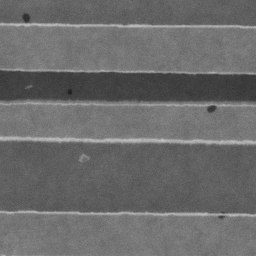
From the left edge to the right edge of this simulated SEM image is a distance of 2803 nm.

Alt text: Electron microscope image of lines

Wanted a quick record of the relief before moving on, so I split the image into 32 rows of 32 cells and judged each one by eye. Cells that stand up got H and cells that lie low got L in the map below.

LLLLLLLLLLLLLLLLLLLLLLLLLLLLLLLL
LLLLLLLLLLLLLLLLLLLLLLLLLLLLLLLL
LLLLLLLLLLLLLLLLLLLLLLLLLLLLLLLL
HHHHHHHHHHHHHHHHHHHHHHHHHHHHHHHH
HHHHHHHHHHHHHHHHHHHHHHHHHHHHHHHH
HHHHHHHHHHHHHHHHHHHHHHHHHHHHHHHH
HHHHHHHHHHHHHHHHHHHHHHHHHHHHHHHH
HHHHHHHHHHHHHHHHHHHHHHHHHHHHHHHH
HHHHHHHHHHHHHHHHHHHHHHHHHHHHHHHH
LLLLLLLLLLLLLLLLLLLLLLLLLLLLLLLL
LLLLLLLLLLLLLLLLLLLLLLLLLLLLLLLL
LLLLLLLLLLLLLLLLLLLLLLLLLLLLLLLL
LLLLLLLLLLLLLLLLLLLLLLLLLLLLLLLL
HHHHHHHHHHHHHHHHHHHHHHHHHHHHHHHH
HHHHHHHHHHHHHHHHHHHHHHHHHHHHHHHH
HHHHHHHHHHHHHHHHHHHHHHHHHHHHHHHH
HHHHHHHHHHHHHHHHHHHHHHHHHHHHHHHH
LLLLLLLLLLLLLLLLLLLLLLHHHHHHHHHH
LLLLLLLLLLLLLLLLLLLLLLLLLLLLLLLL
LLLLLLLLLLLLLLLLLLLLLLLLLLLLLLLL
LLLLLLLLLLLLLLLLLLLLLLLLLLLLLLLL
LLLLLLLLLLLLLLLLLLLLLLLLLLLLLLLL
LLLLLLLLLLLLLLLLLLLLLLLLLLLLLLLL
LLLLLLLLLLLLLLLLLLLLLLLLLLLLLLLL
LLLLLLLLLLLLLLLLLLLLLLLLLLLLLLLL
LLLLLLLLLLLLLLLLLLLLLLLLLLLLLLLL
LLLLLLLLLLLLLLLLLLLLLLLLLLLLLLLL
HHHHHHHHHHHHHHHHHHHHHHHHHHHHHHHH
HHHHHHHHHHHHHHHHHHHHHHHHHHHHHHHH
HHHHHHHHHHHHHHHHHHHHHHHHHHHHHHHH
HHHHHHHHHHHHHHHHHHHHHHHHHHHHHHHH
HHHHHHHHHHHHHHHHHHHHHHHHHHHHHHHH